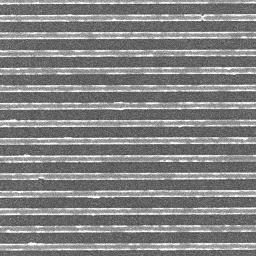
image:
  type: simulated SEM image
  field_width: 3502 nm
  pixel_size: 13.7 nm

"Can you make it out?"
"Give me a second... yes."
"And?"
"parallel lines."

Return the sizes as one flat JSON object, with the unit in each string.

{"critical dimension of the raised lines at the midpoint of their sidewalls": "0.0889 microns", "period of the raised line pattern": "241 nm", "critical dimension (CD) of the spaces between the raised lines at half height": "11.1 pixels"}